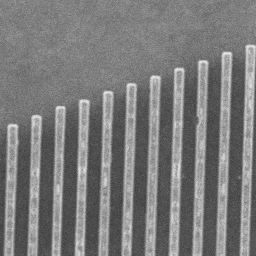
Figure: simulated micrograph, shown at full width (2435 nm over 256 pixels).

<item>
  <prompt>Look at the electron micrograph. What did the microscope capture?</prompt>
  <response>parallel lines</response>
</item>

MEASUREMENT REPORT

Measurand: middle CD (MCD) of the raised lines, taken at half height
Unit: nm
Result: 83.1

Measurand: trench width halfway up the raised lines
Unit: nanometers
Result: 144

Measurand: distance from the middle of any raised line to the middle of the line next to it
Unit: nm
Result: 224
